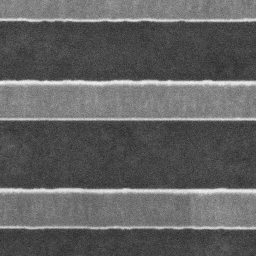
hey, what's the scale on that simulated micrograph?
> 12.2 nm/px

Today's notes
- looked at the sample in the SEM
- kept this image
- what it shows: lines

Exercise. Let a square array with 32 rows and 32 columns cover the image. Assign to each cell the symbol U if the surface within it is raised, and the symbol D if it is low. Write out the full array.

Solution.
UUUUUUUUUUUUUUUUUUUUUUUUUUUUUUUU
UUUUUUUUUUUUUUUUUUUUUUUUUUUUUUUU
UUUUUUUUUUUUUUUUUUUUUUUUUUUUUUUU
DDDDDDDDDDDDDDDDDDDDDDDDDDDDDDDD
DDDDDDDDDDDDDDDDDDDDDDDDDDDDDDDD
DDDDDDDDDDDDDDDDDDDDDDDDDDDDDDDD
DDDDDDDDDDDDDDDDDDDDDDDDDDDDDDDD
DDDDDDDDDDDDDDDDDDDDDDDDDDDDDDDD
DDDDDDDDDDDDDDDDDDDDDDDDDDDDDDDD
DDDDDDDDDDDDDDDDDDDDDDDDDDDDDDDD
UUUUUUUUUUUUUUUUUUUUUUUUUUUUUUUU
UUUUUUUUUUUUUUUUUUUUUUUUUUUUUUUU
UUUUUUUUUUUUUUUUUUUUUUUUUUUUUUUU
UUUUUUUUUUUUUUUUUUUUUUUUUUUUUUUU
UUUUUUUUUUUUUUUUUUUUUUUUUUUUUUUU
DDDDDDDDDDDDDDDDDDDDDDDDDDDDDDDD
DDDDDDDDDDDDDDDDDDDDDDDDDDDDDDDD
DDDDDDDDDDDDDDDDDDDDDDDDDDDDDDDD
DDDDDDDDDDDDDDDDDDDDDDDDDDDDDDDD
DDDDDDDDDDDDDDDDDDDDDDDDDDDDDDDD
DDDDDDDDDDDDDDDDDDDDDDDDDDDDDDDD
DDDDDDDDDDDDDDDDDDDDDDDDDDDDDDDD
DDDDDDDDDDDDDDDDDDDDDDDDDDDDDDDD
DDDDDDDDDDDDDDDDDDDDDDDDDDDDDDDD
UUUUUUUUUUUUUUUUUUUUUUUUUUUUUUUU
UUUUUUUUUUUUUUUUUUUUUUUUUUUUUUUU
UUUUUUUUUUUUUUUUUUUUUUUUUUUUUUUU
UUUUUUUUUUUUUUUUUUUUUUUUUUUUUUUU
DDDUUDDDDDDUUUDDUDDDDDUDUUUUUUUU
DDDDDDDDDDDDDDDDDDDDDDDDDDDDDDDD
DDDDDDDDDDDDDDDDDDDDDDDDDDDDDDDD
DDDDDDDDDDDDDDDDDDDDDDDDDDDDDDDD